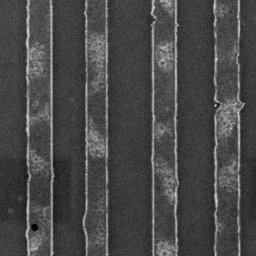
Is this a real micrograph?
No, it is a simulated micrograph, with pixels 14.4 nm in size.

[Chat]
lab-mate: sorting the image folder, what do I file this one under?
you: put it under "one or a few lines or trenches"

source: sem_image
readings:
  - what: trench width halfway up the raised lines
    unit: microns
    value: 0.565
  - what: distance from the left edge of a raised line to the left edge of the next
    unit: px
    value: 62.4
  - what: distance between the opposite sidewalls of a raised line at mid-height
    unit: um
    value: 0.33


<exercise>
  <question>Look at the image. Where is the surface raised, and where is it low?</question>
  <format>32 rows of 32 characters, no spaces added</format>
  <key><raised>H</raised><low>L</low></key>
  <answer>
LLLLHHLLLLLHHLLLLLLHHHLLLLLHHHLL
LLLLHHLLLLLHHLLLLLLHHHLLLLLHHHLL
LLLLHHLLLLLHHLLLLLLHHHLLLLLHHHLL
LLLLHHLLLLLHHLLLLLLHHHLLLLLHHHLL
LLLLHHLLLLLHHLLLLLLHHHLLLLLHHHLL
LLLHHHLLLLLHHLLLLLLHHHLLLLLHHHLL
LLLLHHLLLLLHHLLLLLLHHHLLLLLHHHLL
LLLLHHLLLLLHHLLLLLLHHHLLLLLHHHLL
LLLHHHLLLLLHHLLLLLLHHHLLLLLHHHLL
LLLHHHLLLLLHHLLLLLLHHHLLLLLHHHLL
LLLHHHLLLLLHHLLLLLLHHHLLLLLHHHLL
LLLHHHLLLLLHHLLLLLLHHHLLLLLHHHLL
LLLHHHLLLLLHHLLLLLLHHHLLLLLHHHLL
LLLHHHLLLLLHHLLLLLLHHHLLLLLHHHLL
LLLHHHLLLLLHHLLLLLLHHHLLLLLHHHLL
LLLLHHLLLLLHHLLLLLLHHHLLLLLHHHLL
LLLLHHLLLLLHHLLLLLLHHHLLLLLHHHLL
LLLLHHLLLLLHHLLLLLLHHHLLLLLHHHLL
LLLLHHLLLLLHHLLLLLLHHHLLLLLHHHLL
LLLHHHLLLLLHHLLLLLLHHHLLLLLHHHLL
LLLLHHHLLLLHHLLLLLLHHHLLLLLHHHLL
LLLLHHHLLLLHHLLLLLLHHHLLLLLHHHLL
LLLLHHHLLLLHHLLLLLLHHHLLLLLHHHLL
LLLLHHLLLLLHHLLLLLLHHHLLLLLHHHLL
LLLLHHLLLLLHHLLLLLLHHHLLLLLHHHLL
LLLHHHLLLLLHHLLLLLLHHHLLLLLHHHLL
LLLHHHLLLLLHHLLLLLLHHHLLLLLHHHLL
LLLHHHLLLLLHHLLLLLLHHHLLLLLHHHLL
LLLHHHLLLLLHHLLLLLLHHHLLLLLHHHLL
LLLHHHLLLLLHHLLLLLLHHHLLLLLHHHLL
LLLLHHLLLLLHHLLLLLLHHHLLLLLHHHLL
LLLLHHLLLLLHHLLLLLLHHHLLLLLHHHLL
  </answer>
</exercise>